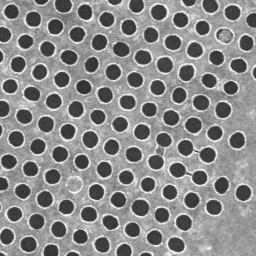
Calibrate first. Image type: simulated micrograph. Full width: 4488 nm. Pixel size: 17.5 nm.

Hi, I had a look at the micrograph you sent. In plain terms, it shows a regular array of holes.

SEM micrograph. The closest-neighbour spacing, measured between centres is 403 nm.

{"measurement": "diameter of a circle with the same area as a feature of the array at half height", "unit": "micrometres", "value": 0.279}